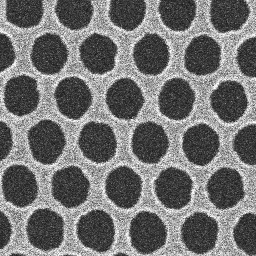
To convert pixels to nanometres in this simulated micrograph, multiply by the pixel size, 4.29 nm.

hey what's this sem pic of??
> a regular array of holes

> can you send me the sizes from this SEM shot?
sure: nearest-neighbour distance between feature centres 216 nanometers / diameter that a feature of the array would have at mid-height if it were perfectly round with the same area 0.173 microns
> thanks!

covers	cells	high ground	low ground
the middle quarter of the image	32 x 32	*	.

*****........*****........****..
******......*******......******.
********..**********....********
....**********...**********...**
.....*******......********.....*
......******.......******.......
.......****.........****........
.......***..........****........
.......***..........****........
.......***..........***.........
.......****.........****........
......*****........*****........
.....*******.......*****.......*
*...*********.....********.....*
******..************...*********
*****......*******......********
****........******.......*****..
****.........****.........****..
****.........****.........****..
.**..........****.........****..
****.........****.........****..
****.........****.........****..
*****........****........*****..
******......******......*******.
*******....********.....*******.
*..***********..****************
....********.....********....***
.....******........*****.......*
......****.........****.........
......****..........**..........
......****..........**..........
......****..........***.........